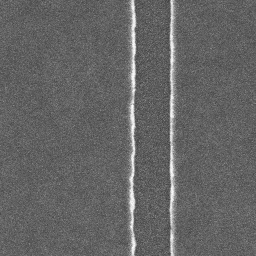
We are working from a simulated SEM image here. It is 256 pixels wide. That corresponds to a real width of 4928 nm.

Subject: one or a few lines or trenches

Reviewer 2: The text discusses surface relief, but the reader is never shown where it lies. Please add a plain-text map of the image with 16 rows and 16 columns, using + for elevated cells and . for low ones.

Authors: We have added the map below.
++++++++...+++++
++++++++...+++++
++++++++...+++++
++++++++...+++++
++++++++...+++++
++++++++...+++++
++++++++...+++++
++++++++...+++++
++++++++...+++++
++++++++...+++++
++++++++...+++++
++++++++...+++++
++++++++...+++++
++++++++...+++++
++++++++...+++++
++++++++...+++++